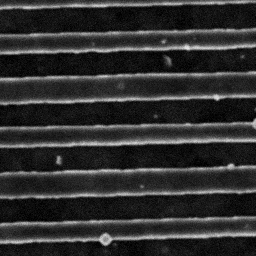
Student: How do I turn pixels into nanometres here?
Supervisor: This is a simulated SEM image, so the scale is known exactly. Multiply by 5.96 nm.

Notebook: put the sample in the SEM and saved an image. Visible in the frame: lines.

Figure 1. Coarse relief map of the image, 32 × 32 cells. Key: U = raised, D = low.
UUUUUUUUUUUUUUUUUUUUUUUDDDDDDDDD
DDDDDDDDDDDDDDDDDDDDDDDDDDDDDDDD
DDDDDDDDDDDDDDDDDDDDDDDDDDDDDDDD
DDDDDDDDDDDDDDDDDDDDDDDDDDDDDDDD
UUUUUUUUUUUUUUUUUUUUUUUUUUUUUUUU
UUUUUUUUUUUUUUUUUUUUUUUUUUUUUUUU
UUUUUUUUDDDDDDDDDDDDDDDDDDDDDDDD
DDDDDDDDDDDDDDDDDDDDDDDDDDDDDDDD
DDDDDDDDDDDDDDDDDDDDDDDDDDDDDDDD
DDDDDDDDDDDDUUUUUUUUUUUUUUUUUUUU
UUUUUUUUUUUUUUUUUUUUUUUUUUUUUUUU
UUUUUUUUUUUUUUUUUUUUUUUUUUUUUUUU
UUUUUUUUUUUUUUUUDDDDDDDDDDDDDDDD
DDDDDDDDDDDDDDDDDDDDDDDDDDDDDDDD
DDDDDDDDDDDDDDDDDDDDDDDDDDDDDDDD
DDDDDDDDDDDDDDDDDDDDDDDUDUUUUUUU
UUUUUUUUUUUUUUUUUUUUUUUUUUUUUUUU
UUUUUUUUUUUUUUUUUUUUUUUUUUUUUUUU
DDDDDDDDDDDDDDDDDDDDDDDDDDDDDDDD
DDDDDDDDDDDDDDDDDDDDDDDDDDDDDDDD
DDDDDDDDDDDDDDDDDDDDDDDDDDDDDDDD
DDDDDDDUUUUUUUUUUUUUUUUUUUUUUUUU
UUUUUUUUUUUUUUUUUUUUUUUUUUUUUUUU
UUUUUUUUUUUUUUUUUUUUUUUUUUUUUUUU
UUUUUUUUUUDDDDDDDDDDDDDDDDDDDDDD
DDDDDDDDDDDDDDDDDDDDDDDDDDDDDDDD
DDDDDDDDDDDDDDDDDDDDDDDDDDDDDDDD
DDDDDDDDDDDDDDDDDDDDUUUUUUUUUUUU
UUUUUUUUUUUUUUUUUUUUUUUUUUUUUUUU
UUUUUUUUUUUUUUUUUUUUUUUUUUUDDDDD
DDDDDDDDDDDDDDDDDDDDDDDDDDDDDDDD
DDDDDDDDDDDDDDDDDDDDDDDDDDDDDDDD